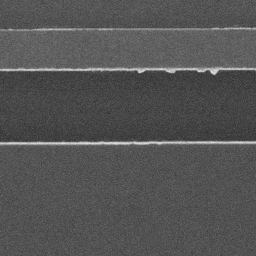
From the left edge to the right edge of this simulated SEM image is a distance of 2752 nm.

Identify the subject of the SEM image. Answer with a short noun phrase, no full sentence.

lines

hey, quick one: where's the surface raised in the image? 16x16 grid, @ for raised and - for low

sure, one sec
@@@@@@@@@@@@@@@@
@@@@@@@@@@@@@@@@
@@@@@@@@@@@@@@@@
@@@@@@@@@@@@@@@@
----------------
----------------
----------------
----------------
----------------
@@@@@@@@@@@@@@@@
@@@@@@@@@@@@@@@@
@@@@@@@@@@@@@@@@
@@@@@@@@@@@@@@@@
@@@@@@@@@@@@@@@@
@@@@@@@@@@@@@@@@
@@@@@@@@@@@@@@@@